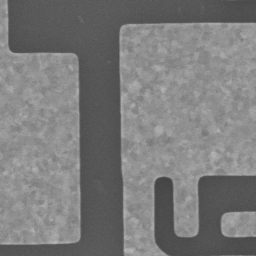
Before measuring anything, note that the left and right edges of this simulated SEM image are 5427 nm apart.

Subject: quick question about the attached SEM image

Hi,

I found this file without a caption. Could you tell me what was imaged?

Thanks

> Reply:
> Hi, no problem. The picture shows wiring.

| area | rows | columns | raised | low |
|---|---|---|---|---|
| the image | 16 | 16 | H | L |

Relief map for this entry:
LLLLLLLLLLLLLLLL
LLLLLLLLLLHHHHHH
HLLLLLLLHHHHHHHH
HHHHHLLLHHHHHHHH
HHHHHLLLHHHHHHHH
HHHHHLLLHHHHHHHH
HHHHHLLLHHHHHHHH
HHHHHLLLHHHHHHHH
HHHHHLLLHHHHHHHH
HHHHHLLLHHHHHHHH
HHHHHLLLHHHHHHHH
HHHHHLLLHHLHLLLL
HHHHHLLLHHLHLLLL
HHHHHLLLHHLHLLHH
HHHHHLLLHHLHLLHH
LLLLLLLLHHLLLLLL